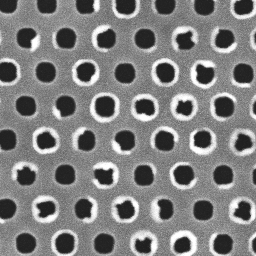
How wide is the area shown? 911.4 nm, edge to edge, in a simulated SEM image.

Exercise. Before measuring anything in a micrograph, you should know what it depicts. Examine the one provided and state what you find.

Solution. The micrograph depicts a regular array of holes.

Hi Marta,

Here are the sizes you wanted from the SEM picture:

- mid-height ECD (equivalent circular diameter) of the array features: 69.4 nm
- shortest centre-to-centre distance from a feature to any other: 138 nm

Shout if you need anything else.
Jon